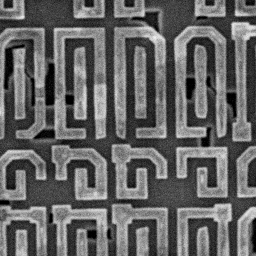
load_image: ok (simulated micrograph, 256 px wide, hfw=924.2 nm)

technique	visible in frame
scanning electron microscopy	wiring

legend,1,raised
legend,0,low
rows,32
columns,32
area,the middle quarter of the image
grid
00011000110001100011000110001100
00011000110001100011000110001100
00011000110001100011000110001100
00011000110001100011000110001100
00011000110001100011000110001100
00011000110001100011000110001100
00011000110001100011000110001100
00011000110001100011000110001100
00011000110001100011000110001100
00011000110001100011000110001100
00011000110001100011000110001100
00011000110001100011000110001100
00011000110001100011000110001100
00011000110001100000000110001100
00000000110001100000000110001100
00000000110001100000000110001100
11111000110001100011111110001111
11111000110001100011111110001111
00000000000000000000000000000000
00000000000000000000000000000000
00000000000011110000000000000000
11111111000011111111111000001111
11111111000011111111111100000111
11111111100011111000011110000110
10000001110001100000000110000100
00000000110001100000000110000100
00011000110001100001000110000100
00011000110001100001000110000100
00011000110001100001000000000000
00011100110000100001000000000000
00011100110001100011000000000000
00011111110001111111000000000000